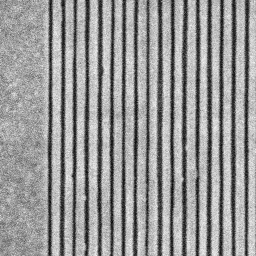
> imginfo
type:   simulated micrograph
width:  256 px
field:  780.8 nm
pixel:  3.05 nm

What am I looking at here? parallel lines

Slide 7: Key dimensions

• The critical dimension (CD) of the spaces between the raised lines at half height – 13 nm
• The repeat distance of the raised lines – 37.4 nm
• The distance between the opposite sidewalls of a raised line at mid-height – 23.3 nm